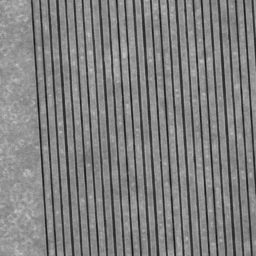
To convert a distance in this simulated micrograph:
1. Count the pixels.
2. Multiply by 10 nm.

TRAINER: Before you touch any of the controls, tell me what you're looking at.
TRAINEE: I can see parallel lines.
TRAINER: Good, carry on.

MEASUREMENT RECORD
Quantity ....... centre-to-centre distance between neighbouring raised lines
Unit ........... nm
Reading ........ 84.9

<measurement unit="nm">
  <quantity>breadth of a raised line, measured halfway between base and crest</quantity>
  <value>65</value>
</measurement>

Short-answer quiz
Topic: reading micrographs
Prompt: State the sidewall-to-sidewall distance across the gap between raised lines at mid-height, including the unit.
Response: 18.7 nm